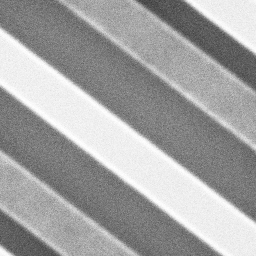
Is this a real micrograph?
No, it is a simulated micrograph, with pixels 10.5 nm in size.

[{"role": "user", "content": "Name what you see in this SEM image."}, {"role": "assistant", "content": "lines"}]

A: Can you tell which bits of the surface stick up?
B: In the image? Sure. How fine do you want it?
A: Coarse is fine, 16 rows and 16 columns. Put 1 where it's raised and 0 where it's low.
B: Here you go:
0000111110001111
0000001111000011
1000000111110001
1100000011111000
1110000000111100
1111100000011111
0011110000001111
0001111000000011
0000111110000001
0000001111000000
1000000111100000
1110000011111000
1111000001111100
0111100000011110
0011111000001111
0001111100000111